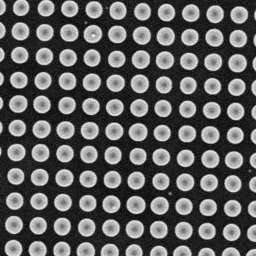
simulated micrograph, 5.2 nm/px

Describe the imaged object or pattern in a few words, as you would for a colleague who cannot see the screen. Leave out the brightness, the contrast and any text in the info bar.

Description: an array of small figures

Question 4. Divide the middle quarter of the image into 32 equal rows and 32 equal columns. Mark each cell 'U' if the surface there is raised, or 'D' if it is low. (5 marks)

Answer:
DDDDDDDUDDDDUUDDDDUUUDDUUUUDDDUU
DDDDDDDDDDDDDDDDDDDDDDDDDDDDDDDD
UUDDDDDDDDDDDDDDDDDDDDDDDDDDDDDD
UUUDDUUUUDDUUUUDDUUUUDDDUUDDDDUU
UUUDDUUUUDDUUUUDDUUUUDDUUUUDDUUU
UUUDDUUUUDDUUUUDDUUUUDDUUUUDDUUU
DDDDDDUUDDDDUUDDDUUUUDDUUUUDDUUU
DDDDDDDDDDDDDDDDDDDDDDDDDDDDDDDD
UUDDDDDDDDDDDDDDDDDDDDDDDDDDDDDD
UUUDDUUUDDDUUUDDDUUUDDDUUUDDDDUU
UUUDDUUUUDDUUUUDDUUUUDDUUUUDDUUU
UUDDDUUUUDDUUUUDDUUUUDDUUUUDDUUU
DDDDDDUUDDDUUUDDDUUUDDDUUUDDDUUU
DDDDDDDDDDDDDDDDDDDDDDDDDDDDDDDD
UDDDDDDDDDDDDDDDDDDDDDDDDDDDDDDD
UUDDDUUUDDDUUUDDDUUUDDDDUDDDDDDD
UUDDUUUUUDDUUUUDUUUUUDDUUUDDDUUU
UUDDUUUUDDDUUUUDUUUUUDUUUUUDDUUU
UDDDDUUUDDDUUUDDDUUUDDDUUUDDDUUU
DDDDDDDDDDDDDDDDDDDDDDDDDDDDDDDD
UDDDDDDDDDDDDDDDDDDDDDDDDDDDDDDD
UUDDUUUUDDDUUUDDDUUUDDDUUDDDDDDD
UUDDUUUUDDUUUUDDDUUUDDUUUUDDDUUU
UUDDUUUUDDUUUUDDDUUUDDUUUUDDUUUU
DDDDDUUDDDDUUUDDDUUUDDDUUUDDUUUU
DDDDDDDDDDDDDDDDDDDDDDDDDDDDDDUD
UDDDDDDDDDDDDDDDDDDDDDDDDDDDDDDD
UUDDUUUUDDDUUUDDDUUDDDDUUDDDDDUD
UUDDUUUUDDUUUUDDUUUUDDUUUUDDUUUU
UUDDUUUUDDUUUUDDUUUUDDUUUUDDUUUU
UDDDDUUDDDDUUDDDUUUUDDDUUUDDUUUU
DDDDDDDDDDDDDDDDDDDDDDDDDDDDDUUD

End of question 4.